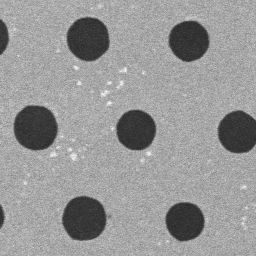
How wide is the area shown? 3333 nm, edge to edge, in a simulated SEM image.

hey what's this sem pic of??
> holes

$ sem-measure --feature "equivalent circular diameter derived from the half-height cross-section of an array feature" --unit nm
554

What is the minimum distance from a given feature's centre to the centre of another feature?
1310 nm